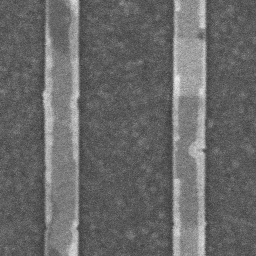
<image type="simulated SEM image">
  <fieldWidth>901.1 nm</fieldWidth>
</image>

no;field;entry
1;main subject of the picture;one or a few lines or trenches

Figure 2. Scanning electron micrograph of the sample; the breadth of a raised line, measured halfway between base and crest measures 111 nanometres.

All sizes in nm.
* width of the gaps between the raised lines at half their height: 338